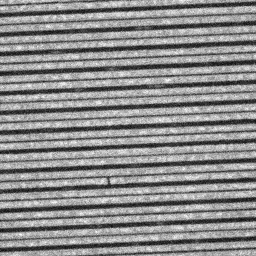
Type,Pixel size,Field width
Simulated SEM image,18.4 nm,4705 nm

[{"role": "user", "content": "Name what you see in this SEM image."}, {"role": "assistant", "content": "parallel lines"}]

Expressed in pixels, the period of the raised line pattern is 9.8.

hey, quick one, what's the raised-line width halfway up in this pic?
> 106 nm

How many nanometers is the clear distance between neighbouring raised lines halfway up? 91.8